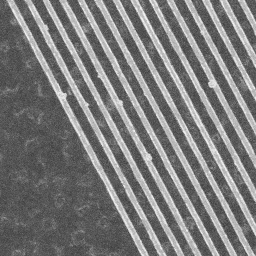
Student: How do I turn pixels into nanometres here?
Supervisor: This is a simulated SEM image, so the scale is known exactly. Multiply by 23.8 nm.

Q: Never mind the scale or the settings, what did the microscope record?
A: parallel lines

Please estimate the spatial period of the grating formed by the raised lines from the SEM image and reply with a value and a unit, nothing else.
0.374 µm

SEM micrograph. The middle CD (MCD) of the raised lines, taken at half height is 129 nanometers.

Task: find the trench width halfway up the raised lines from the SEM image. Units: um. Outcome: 0.253